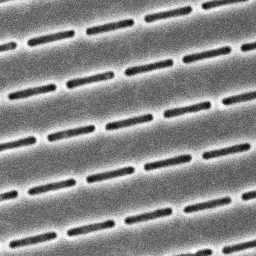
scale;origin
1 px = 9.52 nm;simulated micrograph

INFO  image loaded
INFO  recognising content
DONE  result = a regular array of holes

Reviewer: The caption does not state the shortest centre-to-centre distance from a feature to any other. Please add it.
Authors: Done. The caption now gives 536 nm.